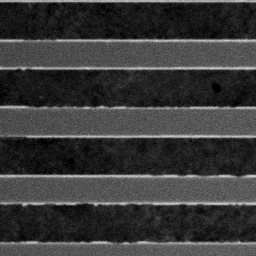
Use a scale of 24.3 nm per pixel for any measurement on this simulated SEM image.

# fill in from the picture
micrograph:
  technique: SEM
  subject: lines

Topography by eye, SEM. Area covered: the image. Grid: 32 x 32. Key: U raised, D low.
DDDDDDDDDDDDDDDDDDDDDDDDDDDDDDDD
DDDDDDDDDDDDDDDDDDDDDDDDDDDDDDDD
DDDDDDDDDDDDDDDDDDDDDDDDDDDDDDDD
DDDDDDDDDDDDDDDDDDDDDDDDDDDDDDDD
DDDDDDDDDDDDDDDDDDDDDDDDDDDDDDDD
UUUUUUUUUUUUUUUUUUUUUUUUUUUUUUUU
UUUUUUUUUUUUUUUUUUUUUUUUUUUUUUUU
UUUUUUUUUUUUUUUUUUUUUUUUUUUUUUUU
DDDDDDDDDDDDDDDDDDDDDDDDDDDDDDDD
DDDDDDDDDDDDDDDDDDDDDDDDDDDDDDDD
DDDDDDDDDDDDDDDDDDDDDDDDDDDDDDDD
DDDDDDDDDDDDDDDDDDDDDDDDDDDDDDDD
DDDDDDDDDDDDDDDDDDDDDDDDDDDDDDDD
UUUUDUDUUDDDUUDDDDDDDDDDDDDDDDDD
UUUUUUUUUUUUUUUUUUUUUUUUUUUUUUUU
UUUUUUUUUUUUUUUUUUUUUUUUUUUUUUUU
UUUUUUUUUUUUUUUUUUUUUUUUUUUUUUUU
DDDDDDDDDDDDDDDDDDDDDDDDDDDDDDDD
DDDDDDDDDDDDDDDDDDDDDDDDDDDDDDDD
DDDDDDDDDDDDDDDDDDDDDDDDDDDDDDDD
DDDDDDDDDDDDDDDDDDDDDDDDDDDDDDDD
DDDDDDDDDDDDDDDDDDDDDDDDDDDDDDDD
UUUUUUUUUUUUUUUUUUUUUUUUUUUUUUUU
UUUUUUUUUUUUUUUUUUUUUUUUUUUUUUUU
UUUUUUUUUUUUUUUUUUUUUUUUUUUUUUUU
DDDDDDDDDDDDDDDDDDDDDDDDDDDDDDDD
DDDDDDDDDDDDDDDDDDDDDDDDDDDDDDDD
DDDDDDDDDDDDDDDDDDDDDDDDDDDDDDDD
DDDDDDDDDDDDDDDDDDDDDDDDDDDDDDDD
DDDDDDDDDDDDDDDDDDDDDDDDDDDDDDDD
UUUUUUUUUUUUUUUUUUUUUUUUUUUUUUUU
UUUUUUUUUUUUUUUUUUUUUUUUUUUUUUUU